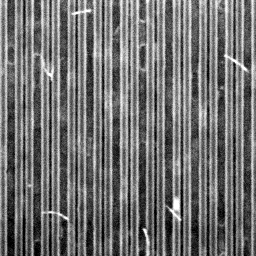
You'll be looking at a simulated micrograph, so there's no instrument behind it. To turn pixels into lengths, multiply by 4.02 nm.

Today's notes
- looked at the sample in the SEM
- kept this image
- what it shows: parallel lines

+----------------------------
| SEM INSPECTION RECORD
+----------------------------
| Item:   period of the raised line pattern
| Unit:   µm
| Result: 0.0522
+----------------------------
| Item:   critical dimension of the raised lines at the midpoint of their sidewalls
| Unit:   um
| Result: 0.0297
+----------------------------